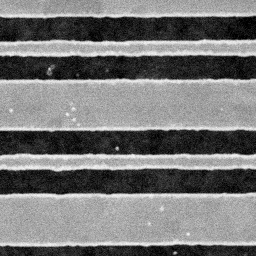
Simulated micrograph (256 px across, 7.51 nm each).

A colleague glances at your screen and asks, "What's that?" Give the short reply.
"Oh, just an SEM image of lines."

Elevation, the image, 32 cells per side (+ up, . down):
++++++++++++++++++++++++++++++++
++++++++++++++++++++++++++++++++
................................
................................
................................
++++++++++++++++++++++++++++++++
++++++++++++++++++++++++++++++++
................................
................................
................................
++++++++++++++++++++++++++++++++
++++++++++++++++++++++++++++++++
++++++++++++++++++++++++++++++++
++++++++++++++++++++++++++++++++
++++++++++++++++++++++++++++++++
++++++++++++++++++++++++++++++++
................................
................................
................................
++++++++++++++++++++++++++++++++
++++++++++++++++++++++++++++++++
................................
................................
................................
++++++++++++++++++++++++++++++++
++++++++++++++++++++++++++++++++
++++++++++++++++++++++++++++++++
++++++++++++++++++++++++++++++++
++++++++++++++++++++++++++++++++
++++++++++++++++++++++++++++++++
++++++++++++++++++++++.+++++++++
................................